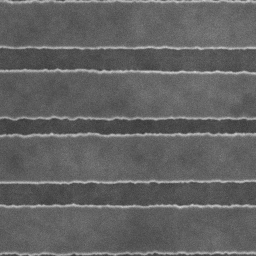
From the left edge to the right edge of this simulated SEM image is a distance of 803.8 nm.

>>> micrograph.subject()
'lines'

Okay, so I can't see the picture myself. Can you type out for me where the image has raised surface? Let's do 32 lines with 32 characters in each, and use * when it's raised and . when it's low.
********************************
********************************
********************************
********************************
********************************
********************************
................................
................................
................................
********************************
********************************
********************************
********************************
********************************
********************************
................................
................................
********************************
********************************
********************************
********************************
********************************
********************************
................................
................................
................................
********************************
********************************
********************************
********************************
********************************
********************************